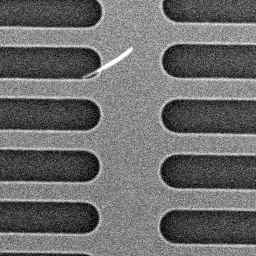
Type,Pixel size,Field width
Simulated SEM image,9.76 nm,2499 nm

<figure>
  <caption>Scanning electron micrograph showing groups of lines, slits or small figures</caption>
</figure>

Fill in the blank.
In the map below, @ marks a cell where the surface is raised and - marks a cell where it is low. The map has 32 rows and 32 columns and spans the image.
-------------@@@@@@@------------
-------------@@@@@@@------------
-------------@@@@@@@@-----------
@@@@-------@@@@@@@@@@@@@@@@@@@@@
@@@@@@@@@@@@@@@@@@@@@@@@@@@@@@@@
@@@@@@@@@@@@@@@@@@@@@@----------
------------@@@@@@@@------------
-------------@@@@@@@------------
-------------@@@@@@@------------
------------@@@@@@@@@-----------
@@@@@@@@@@@@@@@@@@@@@@@@@@@@@@@@
@@@@@@@@@@@@@@@@@@@@@@@@@@@@@@@@
-----------@@@@@@@@@@-----------
------------@@@@@@@@------------
-------------@@@@@@@------------
------------@@@@@@@@------------
@@@@@@@@@@@@@@@@@@@@@-----------
@@@@@@@@@@@@@@@@@@@@@@@@@@@@@@@@
@@@@@@@@@@@@@@@@@@@@@@@@@@@@@@@@
------------@@@@@@@@@-----------
------------@@@@@@@@------------
------------@@@@@@@@------------
------------@@@@@@@@------------
@@@@@@@@@@@@@@@@@@@@@@----------
@@@@@@@@@@@@@@@@@@@@@@@@@@@@@@@@
-----------@@@@@@@@@@@@@@@@@@@@@
------------@@@@@@@@@-----------
------------@@@@@@@@------------
------------@@@@@@@@------------
@@@@@@@@@@@@@@@@@@@@------------
@@@@@@@@@@@@@@@@@@@@@@----------
--------@@@@@@@@@@@@@@@@@@@@@@@@